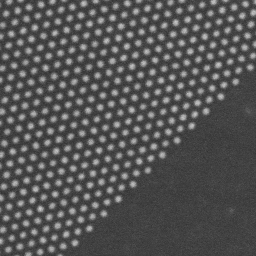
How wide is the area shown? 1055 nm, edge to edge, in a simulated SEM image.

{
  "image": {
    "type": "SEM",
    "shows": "a regular array of raised bodies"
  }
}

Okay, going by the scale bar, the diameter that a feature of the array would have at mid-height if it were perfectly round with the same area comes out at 22.3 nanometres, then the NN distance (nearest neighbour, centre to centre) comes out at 48.2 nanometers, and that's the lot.